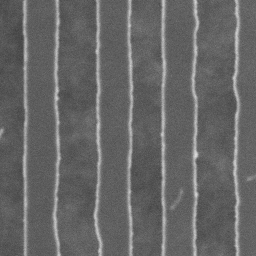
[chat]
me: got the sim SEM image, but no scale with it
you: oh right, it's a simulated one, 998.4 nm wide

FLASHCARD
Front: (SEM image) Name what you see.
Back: lines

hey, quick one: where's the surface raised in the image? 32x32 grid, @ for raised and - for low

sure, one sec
---@@@@-----@@@@----@@@@@----@@@
---@@@@-----@@@@----@@@@@----@@@
---@@@@-----@@@@----@@@@@-----@@
---@@@@-----@@@@----@@@@@-----@@
---@@@@-----@@@@----@@@@-----@@@
---@@@@-----@@@@----@@@@@----@@@
---@@@@-----@@@@----@@@@@----@@@
---@@@@-----@@@@----@@@@-----@@@
---@@@@-----@@@@----@@@@-----@@@
---@@@@-----@@@@----@@@@-----@@@
---@@@@-----@@@@@---@@@@-----@@@
---@@@@-----@@@@@---@@@@-----@@@
---@@@@-----@@@@@---@@@@@-----@@
---@@@@-----@@@@@---@@@@@-----@@
---@@@@-----@@@@----@@@@@----@@@
---@@@@-----@@@@----@@@@@----@@@
---@@@@-----@@@@----@@@@@----@@@
---@@@@-----@@@@----@@@@-----@@@
---@@@@-----@@@@----@@@@-----@@@
---@@@@-----@@@@----@@@@-----@@@
---@@@@-----@@@@----@@@@-----@@@
---@@@@-----@@@@----@@@@-----@@@
---@@@@-----@@@@----@@@@-----@@@
---@@@@-----@@@@----@@@@-----@@@
---@@@@-----@@@@----@@@@@----@@@
---@@@@-----@@@@----@@@@@-----@@
---@@@@-----@@@@----@@@@-----@@@
---@@@@-----@@@@----@@@@-----@@@
---@@@@-----@@@@----@@@@-----@@@
---@@@@-----@@@@----@@@@-----@@@
---@@@@-----@@@@@---@@@@-----@@@
---@@@@-----@@@@----@@@@------@@